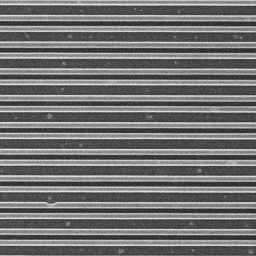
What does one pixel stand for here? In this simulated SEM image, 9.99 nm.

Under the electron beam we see parallel lines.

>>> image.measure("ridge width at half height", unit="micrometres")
0.0512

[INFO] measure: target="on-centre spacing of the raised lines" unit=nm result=132